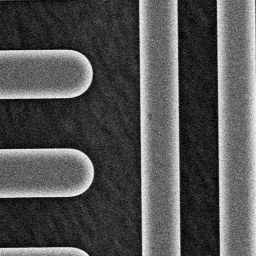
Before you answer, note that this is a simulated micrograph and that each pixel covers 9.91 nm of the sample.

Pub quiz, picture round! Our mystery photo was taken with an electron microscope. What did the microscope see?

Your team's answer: groups of lines, slits or small figures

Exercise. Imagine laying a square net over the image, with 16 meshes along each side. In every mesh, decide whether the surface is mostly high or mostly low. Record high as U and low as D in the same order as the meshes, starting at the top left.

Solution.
DDDDDDDDDUUDDDUU
DDDDDDDDDUUDDDUU
DDDDDDDDDUUDDDUU
UUUUUDDDDUUDDDUU
UUUUUUDDDUUDDDUU
UUUUUDDDDUUDDDUU
DDDDDDDDDUUDDDUU
DDDDDDDDDUUDDDUU
DDDDDDDDDUUDDDUU
UUUUUDDDDUUDDDUU
UUUUUUDDDUUDDDUU
UUUUUUDDDUUDDDUU
DDDDDDDDDUUDDDUU
DDDDDDDDDUUDDDUU
DDDDDDDDDUUDDDUU
DDDUUDDDDUUDDDUU